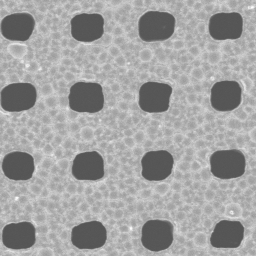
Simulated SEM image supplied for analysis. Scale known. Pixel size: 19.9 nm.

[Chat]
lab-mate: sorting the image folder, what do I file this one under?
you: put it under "a regular array of holes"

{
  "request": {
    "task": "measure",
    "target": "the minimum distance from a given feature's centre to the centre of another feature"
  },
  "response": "68.3 px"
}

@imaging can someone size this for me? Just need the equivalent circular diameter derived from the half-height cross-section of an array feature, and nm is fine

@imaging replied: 652